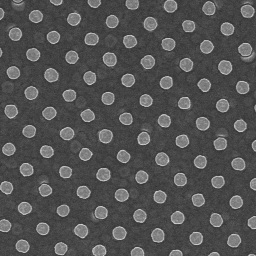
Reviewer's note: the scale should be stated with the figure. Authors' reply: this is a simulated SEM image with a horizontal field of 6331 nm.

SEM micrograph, a regular array of raised bodies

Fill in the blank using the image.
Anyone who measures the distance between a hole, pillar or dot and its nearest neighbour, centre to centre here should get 26.7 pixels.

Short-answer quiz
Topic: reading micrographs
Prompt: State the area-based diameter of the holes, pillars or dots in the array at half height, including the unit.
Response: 0.313 microns